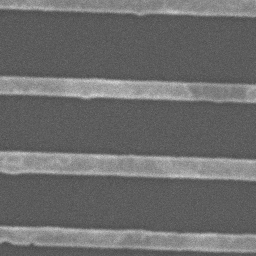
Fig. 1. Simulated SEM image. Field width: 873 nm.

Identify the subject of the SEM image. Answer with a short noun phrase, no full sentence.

one or a few lines or trenches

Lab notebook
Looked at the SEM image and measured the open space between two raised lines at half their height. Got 198 nm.